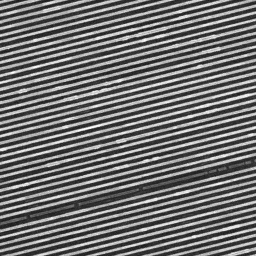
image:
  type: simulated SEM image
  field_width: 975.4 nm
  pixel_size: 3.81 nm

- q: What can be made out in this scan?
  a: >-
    parallel lines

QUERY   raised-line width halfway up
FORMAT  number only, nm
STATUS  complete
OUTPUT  7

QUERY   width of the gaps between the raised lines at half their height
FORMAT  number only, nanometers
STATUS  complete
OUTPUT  16.6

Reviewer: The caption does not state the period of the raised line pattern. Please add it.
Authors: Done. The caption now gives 0.0249 microns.